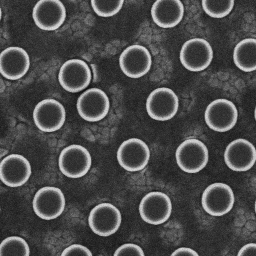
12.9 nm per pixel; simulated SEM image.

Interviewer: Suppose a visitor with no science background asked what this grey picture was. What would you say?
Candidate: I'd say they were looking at a regular array of raised bodies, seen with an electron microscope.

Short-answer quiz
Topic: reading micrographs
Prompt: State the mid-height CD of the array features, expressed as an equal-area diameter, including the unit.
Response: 392 nm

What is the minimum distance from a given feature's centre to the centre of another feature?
628 nm